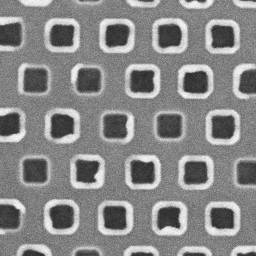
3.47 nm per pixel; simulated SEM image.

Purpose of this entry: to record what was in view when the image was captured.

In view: a regular array of holes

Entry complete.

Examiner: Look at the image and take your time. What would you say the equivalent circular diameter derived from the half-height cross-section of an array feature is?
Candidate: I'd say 89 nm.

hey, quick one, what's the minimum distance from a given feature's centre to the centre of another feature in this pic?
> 180 nm